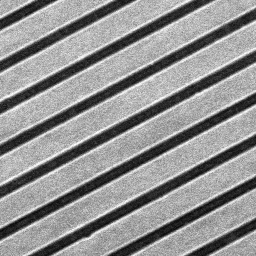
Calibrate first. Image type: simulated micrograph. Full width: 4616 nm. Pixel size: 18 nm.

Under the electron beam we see parallel lines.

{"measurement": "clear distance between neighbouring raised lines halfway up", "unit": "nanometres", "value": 181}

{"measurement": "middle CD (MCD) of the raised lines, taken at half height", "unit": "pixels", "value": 27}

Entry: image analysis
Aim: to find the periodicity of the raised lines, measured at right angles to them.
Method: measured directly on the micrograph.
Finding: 37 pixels